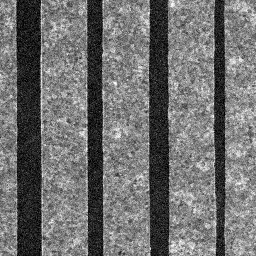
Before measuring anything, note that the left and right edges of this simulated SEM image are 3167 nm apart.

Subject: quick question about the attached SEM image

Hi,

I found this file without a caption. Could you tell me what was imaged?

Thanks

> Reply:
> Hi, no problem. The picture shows one or a few lines or trenches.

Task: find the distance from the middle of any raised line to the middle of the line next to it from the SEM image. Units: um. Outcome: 0.788